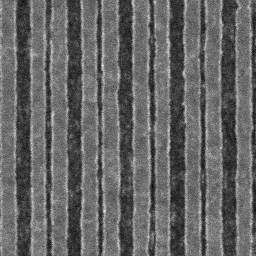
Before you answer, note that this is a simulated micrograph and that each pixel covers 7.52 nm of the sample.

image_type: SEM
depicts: parallel lines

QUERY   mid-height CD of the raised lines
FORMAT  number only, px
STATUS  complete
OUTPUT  14.7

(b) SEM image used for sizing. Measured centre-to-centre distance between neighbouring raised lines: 195 nm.